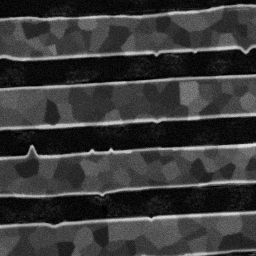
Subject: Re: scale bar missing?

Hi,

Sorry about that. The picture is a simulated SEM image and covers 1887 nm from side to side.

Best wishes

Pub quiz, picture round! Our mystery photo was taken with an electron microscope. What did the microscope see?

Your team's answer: one or a few lines or trenches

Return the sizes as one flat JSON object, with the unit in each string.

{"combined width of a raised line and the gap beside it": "68 px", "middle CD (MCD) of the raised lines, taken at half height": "39.6 pixels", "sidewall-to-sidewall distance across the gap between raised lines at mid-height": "208 nm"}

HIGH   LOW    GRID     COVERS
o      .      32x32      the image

................................
........................oooooooo
oooooooooooooooooooooooooooooooo
oooooooooooooooooooooooooooooooo
oooooooooooooooooooooooooooooooo
oooooooooooooooooooooooooooooooo
ooooooooooooooooooooo...........
................................
................................
..............................oo
............oooooooooooooooooooo
oooooooooooooooooooooooooooooooo
oooooooooooooooooooooooooooooooo
oooooooooooooooooooooooooooooooo
oooooooooooooooooooooooooooo....
oooooooooooo....................
................................
................................
.........................ooooooo
...oo..ooooooooooooooooooooooooo
oooooooooooooooooooooooooooooooo
oooooooooooooooooooooooooooooooo
oooooooooooooooooooooooooooooooo
ooooooooooooooooooo.............
o..oooo.........................
................................
................................
..............oooooooooooooooooo
oooooooooooooooooooooooooooooooo
oooooooooooooooooooooooooooooooo
oooooooooooooooooooooooooooooooo
ooooooooooooooooooooooooooooo...